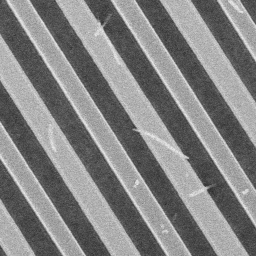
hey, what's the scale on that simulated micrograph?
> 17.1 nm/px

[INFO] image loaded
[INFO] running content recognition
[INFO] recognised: lines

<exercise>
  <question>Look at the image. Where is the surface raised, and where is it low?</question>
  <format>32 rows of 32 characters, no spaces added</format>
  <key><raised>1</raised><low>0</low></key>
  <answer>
01110001111000111000111100011100
00111000111000011100011110001110
00111000011100011100001110000111
00011100011110001110001111000111
00001100001110000111000111100011
10001110001111000111000011100001
10000111000111100011100011110001
11000111000011100001110001111000
11100011100011110001110000111000
11100001110001111000111000111100
11110001110000111000011100011100
01111000111000111100011100001110
00111000011100011110001110001111
00111100011100001110001110000111
00011100001110001111000111000111
00001110001110000111000011100011
10001111000111000111100011100001
10000111000011100011110001110001
11000111100011100001110000111000
11100011110001110001111000111000
11100001110000111000111100011100
01110001111000111000011100001100
00111000111100011100011110001110
00111000011100011110001111000111
00011100011110001110001111000111
00001110001110000111000111100011
10001110000111000111000011110001
11000111000111100011100011110001
11000011100011100001110001111000
11100011100011110001110000111000
11110001110001111000111000111100
01110000110000111000011100011110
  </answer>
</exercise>